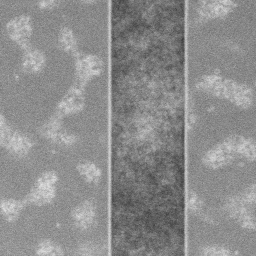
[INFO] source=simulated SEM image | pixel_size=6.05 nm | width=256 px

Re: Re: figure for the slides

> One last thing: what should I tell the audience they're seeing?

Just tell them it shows one or a few lines or trenches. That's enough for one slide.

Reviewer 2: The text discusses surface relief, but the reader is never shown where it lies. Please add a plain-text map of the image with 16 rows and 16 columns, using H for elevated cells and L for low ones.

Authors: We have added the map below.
HHHHHHHLLLLLHHHH
HHHHHHHLLLLLHHHH
HHHHHHHLLLLLHHHH
HHHHHHHLLLLLHHHH
HHHHHHHLLLLLHHHH
HHHHHHHLLLLLHHHH
HHHHHHHLLLLLHHHH
HHHHHHHLLLLLHHHH
HHHHHHHLLLLLHHHH
HHHHHHHLLLLLHHHH
HHHHHHHLLLLLHHHH
HHHHHHHLLLLLHHHH
HHHHHHHLLLLLHHHH
HHHHHHHLLLLLHHHH
HHHHHHHLLLLLHHHH
HHHHHHHLLLLLHHHH